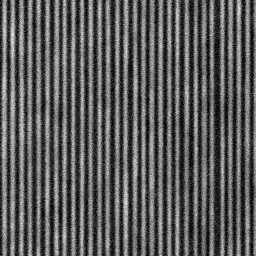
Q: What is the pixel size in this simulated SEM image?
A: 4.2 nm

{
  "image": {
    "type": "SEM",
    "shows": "parallel lines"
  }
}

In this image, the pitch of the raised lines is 36.5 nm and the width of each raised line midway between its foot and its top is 17.3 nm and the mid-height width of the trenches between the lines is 0.0199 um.